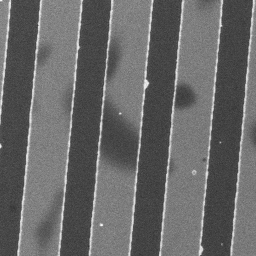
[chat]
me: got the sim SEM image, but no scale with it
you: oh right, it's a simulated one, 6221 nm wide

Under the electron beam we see lines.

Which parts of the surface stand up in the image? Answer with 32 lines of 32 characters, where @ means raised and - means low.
@----@@@@@----@@@@@----@@@@@----
@----@@@@@----@@@@@----@@@@@----
@----@@@@@----@@@@@----@@@@@---@
@----@@@@@----@@@@@----@@@@----@
@----@@@@@----@@@@@---@@@@@----@
@----@@@@@----@@@@@---@@@@@----@
@----@@@@@---@@@@@@---@@@@@----@
@---@@@@@@---@@@@@----@@@@@----@
@---@@@@@@---@@@@@----@@@@@----@
@---@@@@@----@@@@@----@@@@@----@
----@@@@@----@@@@@----@@@@@----@
----@@@@@----@@@@@----@@@@@----@
----@@@@@----@@@@@----@@@@@----@
----@@@@@----@@@@@----@@@@@----@
----@@@@@----@@@@@---@@@@@@---@@
----@@@@@----@@@@@---@@@@@----@@
----@@@@@----@@@@@---@@@@@----@@
----@@@@@---@@@@@----@@@@@----@@
---@@@@@@---@@@@@----@@@@@----@@
---@@@@@----@@@@@----@@@@@----@@
---@@@@@----@@@@@----@@@@@----@@
---@@@@@----@@@@@----@@@@@----@@
---@@@@@----@@@@@----@@@@@----@@
---@@@@@----@@@@@----@@@@@----@@
---@@@@@----@@@@@----@@@@@----@@
---@@@@@----@@@@@----@@@@@---@@@
---@@@@@----@@@@@---@@@@@----@@@
---@@@@@---@@@@@@---@@@@@----@@@
---@@@@@---@@@@@@---@@@@@----@@@
--@@@@@@---@@@@@----@@@@@----@@@
--@@@@@@---@@@@@----@@@@@----@@@
--@@@@@----@@@@@----@@@@@----@@@